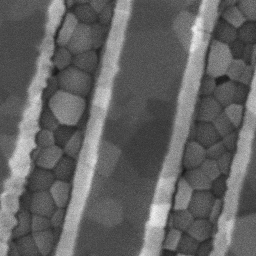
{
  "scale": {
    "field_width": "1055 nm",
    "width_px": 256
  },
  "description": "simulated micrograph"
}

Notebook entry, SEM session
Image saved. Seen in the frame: one or a few lines or trenches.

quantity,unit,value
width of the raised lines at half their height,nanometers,342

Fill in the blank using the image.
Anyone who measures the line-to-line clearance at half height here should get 272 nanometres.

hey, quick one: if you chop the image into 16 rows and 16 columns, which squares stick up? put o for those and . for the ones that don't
oooo....ooooo...
ooo....oooooo...
ooo....oooooo...
ooo....ooooo....
ooo....ooooo....
oo.....ooooo....
oo....oooooo....
oo....ooooo.....
oo....ooooo....o
o.....ooooo....o
o....oooooo....o
o....ooooo.....o
o....ooooo....oo
.....ooooo....oo
....oooooo....oo
....ooooo.....oo